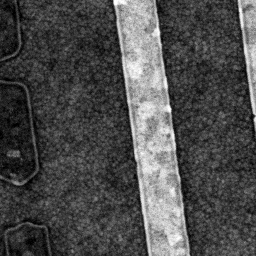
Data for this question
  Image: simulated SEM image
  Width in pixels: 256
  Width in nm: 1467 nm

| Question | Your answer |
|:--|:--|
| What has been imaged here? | one or a few lines or trenches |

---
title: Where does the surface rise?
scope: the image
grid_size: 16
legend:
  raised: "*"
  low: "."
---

*......***.....*
*......***.....*
*.......**.....*
*.......**.....*
........**......
*.......**......
**......***.....
**......***.....
**......***.....
**......***.....
**.......**.....
.........**.....
.........**.....
.........**.....
.**......***....
***......***....